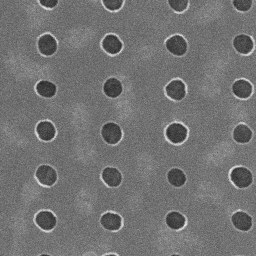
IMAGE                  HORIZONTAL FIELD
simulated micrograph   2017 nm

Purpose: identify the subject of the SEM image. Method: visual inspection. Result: a regular array of holes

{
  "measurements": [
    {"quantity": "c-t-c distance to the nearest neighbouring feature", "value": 344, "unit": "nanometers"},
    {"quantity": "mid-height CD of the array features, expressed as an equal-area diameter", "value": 156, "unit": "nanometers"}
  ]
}